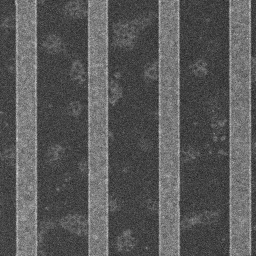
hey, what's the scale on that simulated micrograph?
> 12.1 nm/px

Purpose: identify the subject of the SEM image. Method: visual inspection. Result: one or a few lines or trenches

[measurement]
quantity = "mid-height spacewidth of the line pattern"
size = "630 nm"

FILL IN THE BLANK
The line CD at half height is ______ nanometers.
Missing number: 233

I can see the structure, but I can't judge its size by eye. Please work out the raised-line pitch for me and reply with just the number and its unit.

0.86 microns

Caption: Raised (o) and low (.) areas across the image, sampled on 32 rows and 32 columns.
..oo.......oo.......oo.......oo.
..oo.......oo.......oo.......oo.
..oo.......oo.......oo.......oo.
..oo.......oo.......oo.......oo.
..oo.......oo.......oo.......oo.
..oo.......oo.......oo.......oo.
..oo.......oo.......oo.......oo.
..ooo......oo.......oo.......oo.
..oo.......oo.......oo.......oo.
..oo.......oo.......oo.......oo.
..oo.......oo.......oo.......oo.
..oo.......oo.......oo.......oo.
..oo.......oo.......oo.......oo.
..oo.......oo.......oo.......oo.
..oo.......oo.......oo.......oo.
..oo.......oo.......oo.......oo.
..oo.......oo.......oo.......oo.
..oo.......oo.......oo.......oo.
..oo.......oo.......oo.......oo.
..oo.......oo.......oo.......oo.
..oo.......oo.......oo.......oo.
..oo.......oo.......oo.......oo.
..oo.......oo.......oo.......oo.
..oo.......oo.......oo.......oo.
..oo.......oo.......oo.......oo.
..ooo......oo.......oo.......oo.
..oo.......oo.......oo.......oo.
..oo.......oo.......oo.......oo.
..oo.......oo.......oo.......oo.
..ooo......oo.......oo.......oo.
..ooo......oo.......oo.......oo.
..oo.......oo.......oo.......oo.